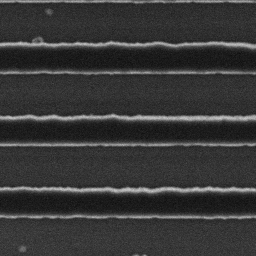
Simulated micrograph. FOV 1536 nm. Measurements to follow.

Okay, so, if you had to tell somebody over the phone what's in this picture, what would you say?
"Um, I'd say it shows lines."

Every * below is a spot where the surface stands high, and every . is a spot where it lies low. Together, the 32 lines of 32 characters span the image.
................................
................................
................................
................................
................................
.***.*.*.**..***..***...******..
********************************
********************************
********************************
................................
................................
................................
................................
................................
...*..*......**.................
********************************
********************************
********************************
................................
................................
................................
................................
................................
*.**.*...............*..*.*.....
********************************
********************************
********************************
................................
................................
................................
................................
................................